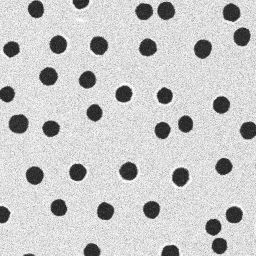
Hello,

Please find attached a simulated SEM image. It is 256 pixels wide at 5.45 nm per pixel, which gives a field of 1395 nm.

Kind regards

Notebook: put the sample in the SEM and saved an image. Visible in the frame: a regular array of holes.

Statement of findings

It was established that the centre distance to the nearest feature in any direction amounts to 186 nm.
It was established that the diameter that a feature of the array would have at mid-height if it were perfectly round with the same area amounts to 16.7 px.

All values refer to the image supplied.